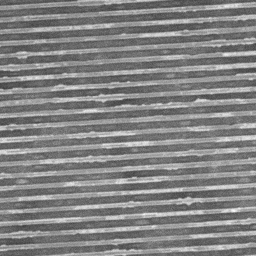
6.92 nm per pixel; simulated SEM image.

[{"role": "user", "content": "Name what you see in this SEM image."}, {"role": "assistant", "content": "parallel lines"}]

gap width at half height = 53.5 nm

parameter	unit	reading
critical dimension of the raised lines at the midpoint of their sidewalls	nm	29.4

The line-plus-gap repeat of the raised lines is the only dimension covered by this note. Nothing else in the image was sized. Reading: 83.1 nanometers